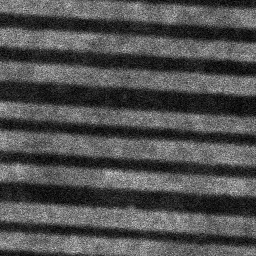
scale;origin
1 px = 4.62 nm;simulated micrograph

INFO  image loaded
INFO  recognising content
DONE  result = parallel lines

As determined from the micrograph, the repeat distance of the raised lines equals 158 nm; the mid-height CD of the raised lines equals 75.4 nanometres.